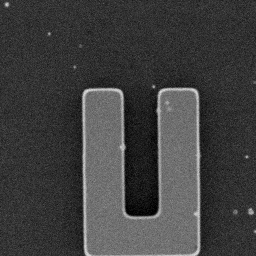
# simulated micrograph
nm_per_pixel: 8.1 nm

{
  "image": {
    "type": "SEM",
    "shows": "groups of lines, slits or small figures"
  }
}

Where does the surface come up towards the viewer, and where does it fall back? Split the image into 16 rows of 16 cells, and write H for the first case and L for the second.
LLLLLLLLLLLLLLLL
LLLLLLLLLLLLLLLL
LLLLLLLLLLLLLLLL
LLLLLLLLLLLLLLLL
LLLLLLLLLLLLLLLL
LLLLLLLLLLLLLLLL
LLLLLHHHLLHHLLLL
LLLLLHHHLLHHLLLL
LLLLLHHHLLHHLLLL
LLLLLHHHLLHHLLLL
LLLLLHHHLLHHLLLL
LLLLLHHHLLHHLLLL
LLLLLHHHLLHHLLLL
LLLLLHHHLHHHLLLL
LLLLLHHHHHHHLLLL
LLLLLHHHHHHHLLLL